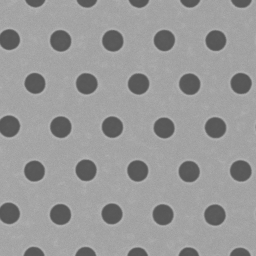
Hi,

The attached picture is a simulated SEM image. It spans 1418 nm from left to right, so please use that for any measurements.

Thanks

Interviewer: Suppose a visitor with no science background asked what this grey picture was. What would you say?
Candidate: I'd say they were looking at a regular array of holes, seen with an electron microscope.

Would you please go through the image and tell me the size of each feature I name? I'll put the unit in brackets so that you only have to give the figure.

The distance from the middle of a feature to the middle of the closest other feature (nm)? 278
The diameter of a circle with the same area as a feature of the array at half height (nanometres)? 116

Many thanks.